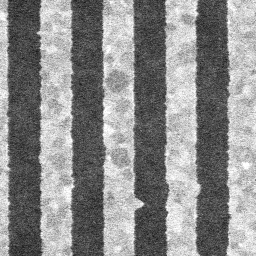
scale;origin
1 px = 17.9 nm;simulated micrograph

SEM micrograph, one or a few lines or trenches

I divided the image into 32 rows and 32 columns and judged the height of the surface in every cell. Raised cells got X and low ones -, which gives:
X----XXXX----XXXX----XXXX---XXXX
X----XXXX----XXXX----XXXX----XXX
X----XXXX----XXXX----XXX----XXXX
X----XXXX----XXXX----XXX----XXXX
X----XXXX----XXXX----XXX-----XXX
X----XXXX----XXXX----XXX-----XXX
X----XXXX----XXXX----XXX-----XXX
X----XXXX----XXXX----XXX-----XXX
X----XXXX----XXXX----XXX-----XXX
X----XXXX----XXXX----XXX-----XXX
X----XXXX----XXXX----XXX-----XXX
X----XXXX----XXXX----XXX-----XXX
X----XXXX----XXXX----XXX-----XXX
X----XXXX----XXXX----XXX-----XXX
X----XXXX----XXXX----XXX-----XXX
X----XXXX----XXXX----XXX-----XXX
X----XXXX----XXXX----XXX-----XXX
X----XXXX----XXXX----XXX-----XXX
X----XXXX----XXXX----XXX-----XXX
X----XXXX----XXXX----XXX-----XXX
X----XXXX----XXXX----XXX-----XXX
X----XXXX----XXXX----XXX-----XXX
X----XXXX----XXXX----XXX-----XXX
X----XXXX----XXXX----XXXX----XXX
X----XXXX----XXXX----XXXX----XXX
X----XXXX----XXXXX---XXXX----XXX
X----XXXX----XXXX----XXX-----XXX
X----XXXX----XXXX----XXX-----XXX
X----XXXX----XXXX----XXX-----XXX
X----XXXX----XXXX----XXX-----XXX
X----XXXX----XXXX----XXX-----XXX
X----XXXX----XXXX----XXXX---XXXX